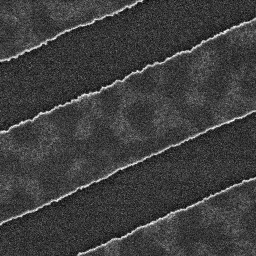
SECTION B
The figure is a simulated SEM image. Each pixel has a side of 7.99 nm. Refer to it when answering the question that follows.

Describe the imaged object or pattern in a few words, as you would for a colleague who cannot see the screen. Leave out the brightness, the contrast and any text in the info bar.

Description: one or a few lines or trenches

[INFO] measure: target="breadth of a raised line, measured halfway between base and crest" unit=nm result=668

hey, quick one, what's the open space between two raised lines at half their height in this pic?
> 488 nm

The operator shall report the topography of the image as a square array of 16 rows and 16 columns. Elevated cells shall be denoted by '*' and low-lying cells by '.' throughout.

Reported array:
********........
******.........*
***..........***
*..........*****
.........*******
.......*********
....************
..*************.
************....
**********......
********........
******.........*
****.........***
*.........******
........********
......**********